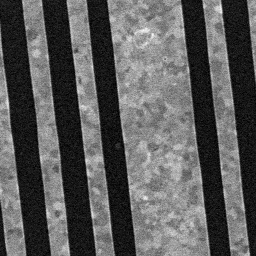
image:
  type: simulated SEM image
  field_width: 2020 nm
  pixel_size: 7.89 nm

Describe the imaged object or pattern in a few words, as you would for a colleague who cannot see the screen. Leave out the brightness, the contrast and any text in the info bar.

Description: groups of lines, slits or small figures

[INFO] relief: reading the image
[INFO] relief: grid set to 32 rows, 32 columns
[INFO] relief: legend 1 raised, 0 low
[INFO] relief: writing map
00011000111000111111111001110001
00011000011000111111111000110001
00011000011000111111111000110001
00011100011000111111111000110001
00011100011000111111111000110001
00011100011000111111111000110001
00001100011000111111111000110000
00001100011000111111111000110000
00001100011100111111111100111000
10001100011100011111111100111000
10001100001100011111111100011000
10001100001100011111111100011000
10001110001100011111111100011000
10001110001100011111111100011000
10000110001100011111111100011000
10000110001100011111111100011000
10000110001100011111111100011000
11000110001110011111111100011100
11000110000110001111111110011100
11000110000110001111111110011100
11000111000110001111111110001100
11000111000110001111111110001100
11000111000110001111111110001100
11000011000110001111111110001100
11000011000110001111111110001100
11100011000111001111111110001100
11100011000111000111111111001110
11100011000011000111111111001110
01100011000011000111111111000110
01100011000011000111111111000110
01100011100011000111111111000110
01100011100011000111111111000110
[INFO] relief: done